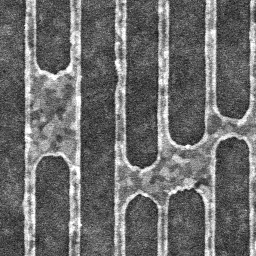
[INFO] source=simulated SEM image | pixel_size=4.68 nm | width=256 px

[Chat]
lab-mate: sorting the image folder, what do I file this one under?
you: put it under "parallel lines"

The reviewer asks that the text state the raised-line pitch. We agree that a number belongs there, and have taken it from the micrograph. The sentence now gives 0.21 micrometres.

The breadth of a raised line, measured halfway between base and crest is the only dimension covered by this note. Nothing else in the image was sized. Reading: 9.02 px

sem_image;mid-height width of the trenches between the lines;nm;169